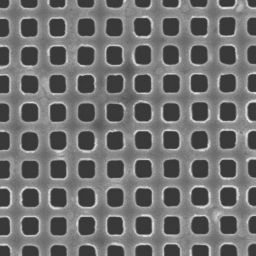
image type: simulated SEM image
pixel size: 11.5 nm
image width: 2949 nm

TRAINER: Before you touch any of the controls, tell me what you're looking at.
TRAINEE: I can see a regular array of holes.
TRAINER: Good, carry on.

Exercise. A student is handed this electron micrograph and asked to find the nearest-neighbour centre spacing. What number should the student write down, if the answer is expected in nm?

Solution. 322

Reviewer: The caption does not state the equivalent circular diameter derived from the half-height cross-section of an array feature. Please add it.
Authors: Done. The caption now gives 217 nm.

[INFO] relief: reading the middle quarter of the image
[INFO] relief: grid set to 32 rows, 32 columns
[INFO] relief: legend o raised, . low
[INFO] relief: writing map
oooooooooooooooooooooooooooooooo
oooooooooooooooooooooooooooooooo
oooooooooooooooooooooooooo.ooooo
ooo....oooo....ooo....ooo....ooo
ooo.....ooo....ooo....ooo....ooo
.oo.....oo.....ooo....ooo....ooo
oooo....ooo....ooo....ooo....ooo
oooooooooooooooooooooooooooooooo
oooooooooooooooooooooooooooooooo
oooooooooooooooooooooooooooooooo
oooo...oooo....ooo....ooo....ooo
.oo.....oo.....oo.....ooo....ooo
.oo.....oo.....ooo....ooo....ooo
oooo....ooo....ooo....ooo....ooo
ooooo.oooooo..ooooo..ooooooooooo
oooooooooooooooooooooooooooooooo
oooooooooooooooooooooooooooooooo
oooo...oooo....ooo....ooo....ooo
.oo.....ooo....ooo....ooo....ooo
.oo.....ooo....ooo....ooo....ooo
oooo....ooo....ooo....ooo....ooo
oooo...ooooo.ooooooooooooooooooo
oooooooooooooooooooooooooooooooo
oooooooooooooooooooooooooooooooo
oooo...oooo....ooo....ooo....ooo
.oo.....ooo....ooo....ooo....ooo
.oo.....ooo....ooo....ooo....ooo
.ooo....ooo....ooo....ooo....ooo
ooooo..ooooo..ooooo.oooooo..oooo
oooooooooooooooooooooooooooooooo
oooooooooooooooooooooooooooooooo
oooo...oooo...oooo....ooo....ooo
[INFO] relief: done